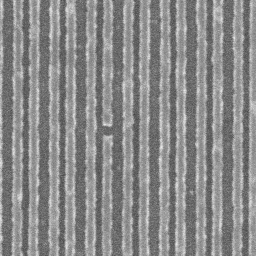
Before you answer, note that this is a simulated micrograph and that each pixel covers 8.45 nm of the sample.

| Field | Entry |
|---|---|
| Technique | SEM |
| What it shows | parallel lines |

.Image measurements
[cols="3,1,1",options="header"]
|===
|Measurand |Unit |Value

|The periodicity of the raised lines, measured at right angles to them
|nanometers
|155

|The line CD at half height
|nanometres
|69.7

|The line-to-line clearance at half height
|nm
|88.2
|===